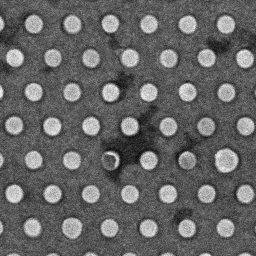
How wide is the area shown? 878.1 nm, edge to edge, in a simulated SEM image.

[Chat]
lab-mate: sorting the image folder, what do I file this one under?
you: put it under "a regular array of raised bodies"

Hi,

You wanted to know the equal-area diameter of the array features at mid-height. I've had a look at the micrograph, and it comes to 61.3 nm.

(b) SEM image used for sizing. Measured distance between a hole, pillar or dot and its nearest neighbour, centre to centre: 131 nm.